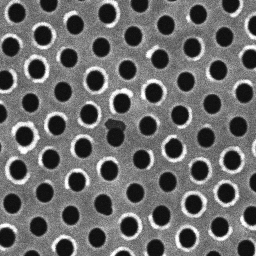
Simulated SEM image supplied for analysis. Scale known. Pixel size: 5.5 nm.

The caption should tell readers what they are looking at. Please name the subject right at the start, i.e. a regular array of holes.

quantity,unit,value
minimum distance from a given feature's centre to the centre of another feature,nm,186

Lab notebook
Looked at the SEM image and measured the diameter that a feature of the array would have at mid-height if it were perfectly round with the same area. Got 0.0993 um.